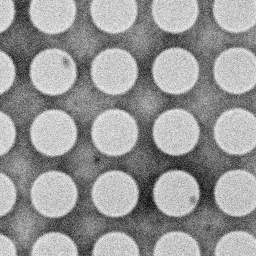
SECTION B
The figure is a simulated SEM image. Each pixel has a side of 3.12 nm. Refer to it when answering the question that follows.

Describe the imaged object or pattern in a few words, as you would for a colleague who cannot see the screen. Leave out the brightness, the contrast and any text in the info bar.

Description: an array of small figures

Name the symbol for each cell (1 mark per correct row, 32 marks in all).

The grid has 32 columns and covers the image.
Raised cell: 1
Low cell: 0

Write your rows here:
11001111100011111001111110011111
11001111100111111001111110011111
11001111100011111001111100011111
10000111000001110000111000001110
00000000000000000000000000000000
00000000000000000000000000000000
00000111000001110000011000001110
10001111100011111001111100011111
11001111100011111001111110011111
11001111100011111001111110011111
10001111100011111000111100011111
00000111000001100000011000000110
00000000000000000000000000000000
00000000000000000000000000000000
10000111100001110000111100001111
11001111100011111001111110011111
11001111110011111001111110011111
11001111100011111001111110011111
10000111100011110000111100001111
00000000000000000000000000000000
00000000000000000000000000000000
00000000000000000000011000000110
10000111100011111000111100001111
11001111100011111001111110011111
11001111110011111001111110011111
11001111100011111000111110011111
10000111000001110000011100001110
00000000000000000000000000000000
00000000000000000000000000000000
00000111000001110000011100001110
11001111100011111000111110011111
11001111110011111001111110011111